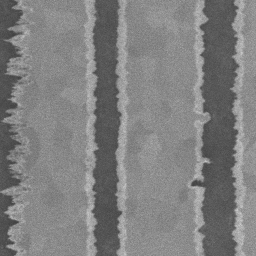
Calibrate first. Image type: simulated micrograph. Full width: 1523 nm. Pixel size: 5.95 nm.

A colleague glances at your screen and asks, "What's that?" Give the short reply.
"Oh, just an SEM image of one or a few lines or trenches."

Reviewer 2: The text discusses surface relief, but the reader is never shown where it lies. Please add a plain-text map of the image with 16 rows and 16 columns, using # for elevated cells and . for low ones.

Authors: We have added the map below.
.#####..#####..#
.#####..####...#
.#####..####...#
.#####..####...#
.#####..####...#
.#####..####...#
.#####..####...#
.#####..#####..#
.#####..#####..#
.#####..#####..#
.#####.######..#
.#####..####...#
.#####..####...#
.#####..####...#
.#####..####...#
.#####..#####..#